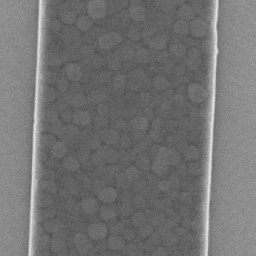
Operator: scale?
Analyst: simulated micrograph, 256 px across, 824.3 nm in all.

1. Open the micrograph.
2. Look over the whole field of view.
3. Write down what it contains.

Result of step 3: one or a few lines or trenches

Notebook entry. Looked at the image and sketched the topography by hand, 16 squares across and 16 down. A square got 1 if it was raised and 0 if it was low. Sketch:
0001111111111100
0011111111111000
0011111111111100
0011111111111100
0011111111111000
0011111111111000
0011111111111000
0011111111111000
0011111111111000
0011111111111000
0011111111111000
0011111111111000
0011111111111000
0011111111111000
0011111111111000
0011111111111000